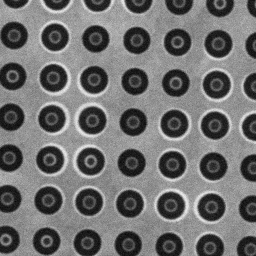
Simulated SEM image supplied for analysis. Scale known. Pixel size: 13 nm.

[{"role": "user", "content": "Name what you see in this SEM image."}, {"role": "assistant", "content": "an array of small figures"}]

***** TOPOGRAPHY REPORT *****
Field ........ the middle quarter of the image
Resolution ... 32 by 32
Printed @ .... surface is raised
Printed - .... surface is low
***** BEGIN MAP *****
@@@@@@--@@@@@@@@@@@@@@@@@@@@@@@@
-@@@@-----@@@@@@----@@@@@@@---@@
-@@@-------@@@@------@@@@------@
-@@@--@@@--@@@---@@--@@@@------@
-@@@--@@@--@@@--@@@--@@@---@@---
-@@@-------@@@---@@--@@@---@@---
@@@@------@@@@@-----@@@@@------@
@@@@@----@@@@@@@---@@@@@@@----@@
@@@@@@@@@@@@@@@@@@@@@@@@@@@@@@@@
@@@@@@@@@@@@@@@@@@@@@@@@@@@@@@@@
@@@@@----@@@@@@@@@@@@@@@@@@@@@@@
@@@@------@@@@@----@@@@@@@---@@@
-@@--------@@@------@@@@@------@
-@@---@@---@@@--@@---@@@-------@
-@@---@@---@@@--@@@--@@@--@@@--@
@@@--------@@@--@@---@@@--@@@---
@@@@------@@@@------@@@@-------@
@@@@@----@@@@@@----@@@@@@------@
@@@@@@@@@@@@@@@@@@@@@@@@@@---@@@
@@@@@@@@@@@@@@@@@@@@@@@@@@@@@@@@
@@@@@@-@@@@@@@@@@@@@@@@@@@@@@@@@
@@@@-----@@@@@@---@@@@@@@@--@@@@
@@@-------@@@@------@@@@@-----@@
-@@---@---@@@@--@@--@@@@------@@
-@@---@@--@@@---@@--@@@---@@---@
@@@---@---@@@---@@--@@@---@@@--@
@@@-------@@@@------@@@@------@@
@@@@-----@@@@@-----@@@@@------@@
@@@@@@@@@@@@@@@@@@@@@@@@@----@@@
@@@@@@@@@@@@@@@@@@@@@@@@@@@@@@@@
@@@@@@@@@@@@@@@@@@@@@@@@@@@@@@@@
@@@@-----@@@@@@---@@@@@@@@-@@@@@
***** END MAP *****